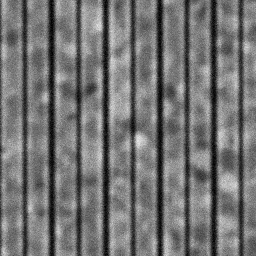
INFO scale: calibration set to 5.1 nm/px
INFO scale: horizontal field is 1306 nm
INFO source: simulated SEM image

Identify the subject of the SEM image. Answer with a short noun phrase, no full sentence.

parallel lines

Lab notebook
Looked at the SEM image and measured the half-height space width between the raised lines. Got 6 px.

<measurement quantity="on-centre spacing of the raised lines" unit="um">0.138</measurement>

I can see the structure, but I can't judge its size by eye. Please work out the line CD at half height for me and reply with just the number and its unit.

20 pixels